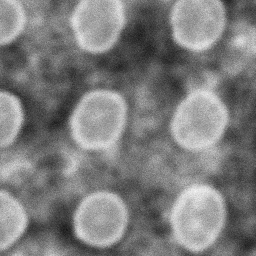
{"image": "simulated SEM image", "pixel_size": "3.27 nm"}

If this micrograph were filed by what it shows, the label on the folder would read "raised bodies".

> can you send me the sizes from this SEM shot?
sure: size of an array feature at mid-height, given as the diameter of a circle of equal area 54.8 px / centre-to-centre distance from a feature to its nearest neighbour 319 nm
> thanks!